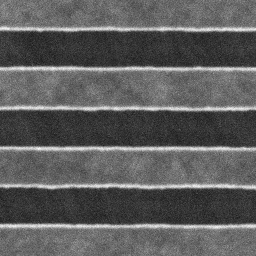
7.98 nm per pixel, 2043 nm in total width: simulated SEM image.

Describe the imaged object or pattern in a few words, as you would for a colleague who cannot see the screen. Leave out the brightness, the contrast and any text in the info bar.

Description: lines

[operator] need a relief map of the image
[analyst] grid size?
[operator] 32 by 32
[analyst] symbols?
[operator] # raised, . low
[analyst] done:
################################
################################
################################
################################
................................
................................
................................
................................
..#.######......###.....#.......
################################
################################
################################
################################
################################
................................
................................
................................
................................
#############################...
################################
################################
################################
################################
......#..........###...........#
................................
................................
................................
................................
################################
################################
################################
################################